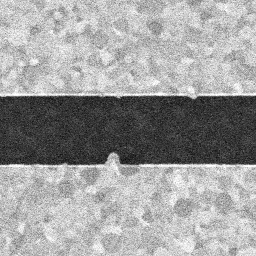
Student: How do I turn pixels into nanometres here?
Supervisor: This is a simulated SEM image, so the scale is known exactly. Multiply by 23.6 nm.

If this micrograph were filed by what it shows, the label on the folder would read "one or a few lines or trenches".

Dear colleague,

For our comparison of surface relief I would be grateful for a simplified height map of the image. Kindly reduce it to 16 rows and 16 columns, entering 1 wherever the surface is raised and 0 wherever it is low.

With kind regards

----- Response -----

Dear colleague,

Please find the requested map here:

1111111111111111
1111111111111111
1111111111111111
1111111111111111
1111111111111111
1111111111111111
0000000000000000
0000000000000000
0000000000000000
0000000000000000
1111111111111111
1111111111111111
1111111111111111
1111111111111111
1111111111111111
1111111111111111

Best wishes